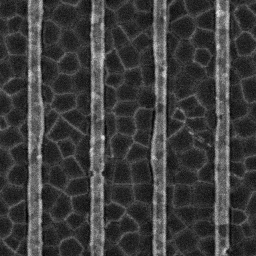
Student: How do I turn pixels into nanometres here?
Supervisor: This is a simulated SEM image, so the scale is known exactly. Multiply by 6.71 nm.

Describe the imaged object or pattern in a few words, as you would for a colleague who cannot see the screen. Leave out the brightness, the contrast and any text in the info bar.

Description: one or a few lines or trenches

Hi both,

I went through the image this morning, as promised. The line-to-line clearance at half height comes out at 52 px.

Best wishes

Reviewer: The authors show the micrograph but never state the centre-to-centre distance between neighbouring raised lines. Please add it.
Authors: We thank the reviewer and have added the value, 419 nanometers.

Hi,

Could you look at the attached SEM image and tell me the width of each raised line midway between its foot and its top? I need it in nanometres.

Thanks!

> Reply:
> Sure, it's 69.6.